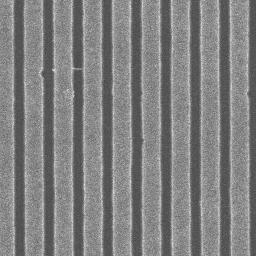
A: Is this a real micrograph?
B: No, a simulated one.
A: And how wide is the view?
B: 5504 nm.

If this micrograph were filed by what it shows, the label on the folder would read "parallel lines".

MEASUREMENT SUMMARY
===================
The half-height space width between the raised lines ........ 202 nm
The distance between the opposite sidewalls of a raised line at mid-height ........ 436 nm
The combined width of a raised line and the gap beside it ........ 632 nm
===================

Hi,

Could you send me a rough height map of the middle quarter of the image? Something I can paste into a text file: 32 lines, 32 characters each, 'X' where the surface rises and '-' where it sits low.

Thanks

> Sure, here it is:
XX---XXXXX--XXXXX---XXXX---XXXXX
XX--XXXXXX--XXXXX--XXXXX---XXXXX
XX---XXXXX--XXXXX--XXXXX---XXXXX
XX---XXXXX--XXXXX--XXXXX---XXXXX
XX---XXXXX--XXXXX--XXXXX---XXXXX
XX---XXXX---XXXXX--XXXXX---XXXXX
XX---XXXXX--XXXXX--XXXXX---XXXXX
XX---XXXXX--XXXXX---XXXX---XXXXX
XX---XXXX---XXXXX--XXXXX---XXXXX
XX---XXXX---XXXXX--XXXXX---XXXXX
XX---XXXX---XXXXX--XXXXX---XXXXX
XX---XXXXX--XXXXX--XXXXX---XXXXX
XX---XXXXX--XXXXX--XXXXX---XXXXX
XX---XXXXX--XXXXX---XXXX---XXXXX
XX---XXXXX--XXXXX---XXXX---XXXXX
XX---XXXXX--XXXXX---XXXX---XXXXX
XX---XXXXX--XXXXX---XXXX---XXXXX
XX---XXXXX--XXXXX---XXXX---XXXXX
XX---XXXXX--XXXXX---XXXX---XXXXX
XX---XXXXX--XXXXX---XXXX---XXXXX
XX---XXXXX--XXXXX---XXXX---XXXX-
XX---XXXX---XXXXX---XXXX---XXXXX
XX---XXXXX--XXXXX---XXXX---XXXXX
XX---XXXXX--XXXXX---XXXX---XXXXX
XX---XXXXX--XXXXX---XXXX---XXXXX
XX---XXXXX--XXXXX---XXXX---XXXXX
XX---XXXXX--XXXXX---XXXX---XXXX-
XX---XXXXX--XXXXX---XXXX---XXXX-
XX---XXXXX--XXXXX---XXXX---XXXX-
XX---XXXXX--XXXXX---XXXX---XXXX-
XX---XXXXX--XXXXX--XXXXX---XXXXX
XX---XXXXX--XXXXX--XXXXX---XXXXX